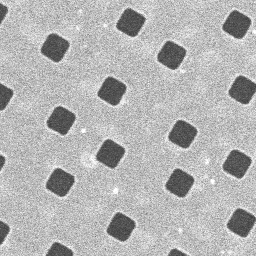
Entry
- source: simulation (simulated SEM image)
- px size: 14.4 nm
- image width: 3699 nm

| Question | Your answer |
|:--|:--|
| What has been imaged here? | a regular array of holes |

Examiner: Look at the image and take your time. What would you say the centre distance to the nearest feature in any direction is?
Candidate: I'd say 0.842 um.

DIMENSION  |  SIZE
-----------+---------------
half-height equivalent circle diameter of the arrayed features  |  396 nanometres